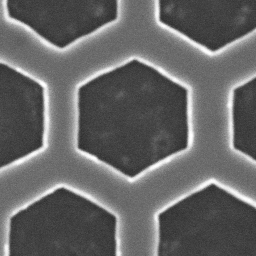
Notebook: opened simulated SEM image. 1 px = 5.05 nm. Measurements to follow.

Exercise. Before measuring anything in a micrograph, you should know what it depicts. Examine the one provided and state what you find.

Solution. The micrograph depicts holes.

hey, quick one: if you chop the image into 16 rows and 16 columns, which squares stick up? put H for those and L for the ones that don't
LLLLLLLHHHLLLLLL
HLLLLLLHHHLLLLLL
HHHLLHHHHHHHLLLH
HHHHHHHHHHHHHHHH
LHHHHHHLLLHHHHHH
LLLHHLLLLLLLHHHL
LLLHHLLLLLLLHHLL
LLLHHLLLLLLLHHHL
LLLHHLLLLLLLHHHL
LLHHHLLLLLLHHHHL
HHHHHHHLLHHHHHHH
HHHHHHHHHHHHHHHH
HHLLLLHHHHHLLLLH
HLLLLLLHHHLLLLLL
HLLLLLLHHHLLLLLL
HLLLLLLHHHLLLLLL